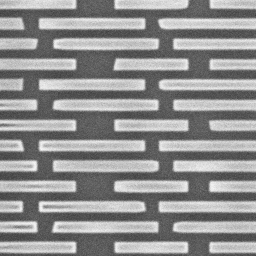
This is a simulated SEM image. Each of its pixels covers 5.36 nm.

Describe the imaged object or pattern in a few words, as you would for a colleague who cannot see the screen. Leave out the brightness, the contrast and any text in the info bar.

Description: wiring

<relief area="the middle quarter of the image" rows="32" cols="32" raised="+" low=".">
+++..........++++++++++++++++++.
................................
................................
................................
++++++++++++++++++++....++++++++
++++++++++++++++++++....++++++++
................................
................................
................................
+++++++++++++++++++++++.....++++
+++++++++++++++++++++++.....++++
................................
................................
................................
+++..........++++++++++++++++++.
+++..........++++++++++++++++++.
................................
................................
................................
++++++++++++++++++++....++++++++
++++++++++++++++++++....++++++++
................................
................................
................................
+++++++++++++++++++++++.....++++
+++++++++++++++++++++++.....++++
+++++++++++++++++++++++.....++++
................................
................................
................................
+++..........++++++++++++++++++.
+++..........++++++++++++++++++.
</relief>